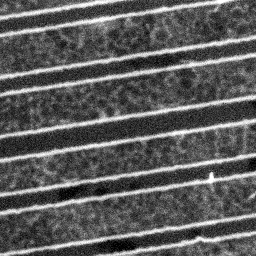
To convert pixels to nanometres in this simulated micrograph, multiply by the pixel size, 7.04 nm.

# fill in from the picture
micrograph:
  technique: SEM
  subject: parallel lines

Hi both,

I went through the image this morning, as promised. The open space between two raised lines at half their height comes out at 125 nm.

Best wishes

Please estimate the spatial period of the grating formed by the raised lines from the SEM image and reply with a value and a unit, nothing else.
413 nanometers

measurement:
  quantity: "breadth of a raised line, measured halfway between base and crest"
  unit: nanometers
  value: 291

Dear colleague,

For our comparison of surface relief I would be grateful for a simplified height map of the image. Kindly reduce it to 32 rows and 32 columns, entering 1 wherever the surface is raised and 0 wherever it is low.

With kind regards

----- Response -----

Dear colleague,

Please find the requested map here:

11111111111100000000000001111111
11111000000000000001111111111111
00000000000001111111111111111111
00000011111111111111111111111111
11111111111111111111111111111111
11111111111111111111111111100000
11111111111111111111000000000000
11111111111111000000000000001111
11111110000000000000001111111111
10000000000000011111111111111111
00000000011111111111111111111111
00111111111111111111111111111111
11111111111111111111111111111000
11111111111111111111111000000000
11111111111111110000000000000000
11111111110000000000000000000011
11110000000000000000000111111111
00000000000000000111111111111111
00000000001111111111111111111111
00001111111111111111111111111110
11111111111111111111111110000000
11111111111111111110000000000000
11111111111100000000000000111111
11111100000000000000011111111111
00000000000000111111111111111111
00000000111111111111111111111111
01111111111111111111111111111111
11111111111111111111111111110000
11111111111111111111110000000000
11111111111111110000000000000111
11111111100000000000000111111111
11100000000000000111111111111111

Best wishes